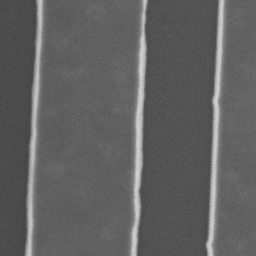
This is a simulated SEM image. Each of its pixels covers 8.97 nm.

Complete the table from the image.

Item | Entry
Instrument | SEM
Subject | one or a few lines or trenches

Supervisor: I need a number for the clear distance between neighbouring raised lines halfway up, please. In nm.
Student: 669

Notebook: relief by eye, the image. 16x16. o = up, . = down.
..ooooooo.....oo
..ooooooo.....oo
..ooooooo.....oo
..ooooooo.....oo
..ooooooo.....oo
..ooooooo.....oo
..ooooooo....ooo
..ooooooo....ooo
..ooooooo....ooo
..ooooooo....ooo
..ooooooo....ooo
..ooooooo....ooo
..ooooooo....ooo
..ooooooo....ooo
..ooooooo....ooo
..oooooo.....ooo